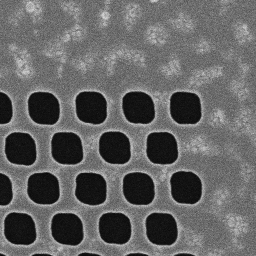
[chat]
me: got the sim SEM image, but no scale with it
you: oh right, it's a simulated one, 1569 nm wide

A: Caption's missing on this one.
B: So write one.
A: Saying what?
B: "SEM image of a regular array of holes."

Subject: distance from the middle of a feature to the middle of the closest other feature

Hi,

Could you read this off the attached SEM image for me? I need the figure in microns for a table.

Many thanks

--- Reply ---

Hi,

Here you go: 0.285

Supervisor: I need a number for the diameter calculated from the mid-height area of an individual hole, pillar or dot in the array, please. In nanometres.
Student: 205